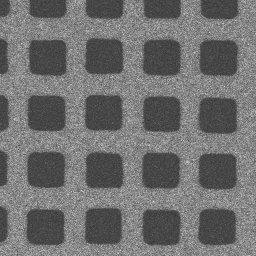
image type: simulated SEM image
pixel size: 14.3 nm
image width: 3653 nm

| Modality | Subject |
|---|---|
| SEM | a regular array of holes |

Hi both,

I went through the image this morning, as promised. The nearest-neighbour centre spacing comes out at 799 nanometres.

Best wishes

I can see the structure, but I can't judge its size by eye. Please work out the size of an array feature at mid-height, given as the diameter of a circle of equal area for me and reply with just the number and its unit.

0.574 micrometres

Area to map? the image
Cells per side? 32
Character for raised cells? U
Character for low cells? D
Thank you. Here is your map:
DUUUDDDDUUUDDDDUUUDDDDDUUDDDDDUU
DUUUDDDDUUUDDDDUUUDDDDDUUDDDDDUU
UUUUUUUUUUUUUUUUUUUUUUUUUUUUUUUU
UUUUUUUUUUUUUUUUUUUUUUUUUUUUUUUU
UUUUUUUUUUUUUUUUUUUUUUUUUUUUUUUU
DUUUDDDDUUUDDDDUUUDDDDUUUDDDDUUU
DUUUDDDDUUUDDDDUUUDDDDDUUDDDDDUU
DUUUDDDDUUUDDDDUUUDDDDDUUDDDDDUU
DUUUDDDDUUUDDDDUUUDDDDUUUDDDDDUU
UUUUUUUUUUUUUUUUUUUUUUUUUUUDDUUU
UUUUUUUUUUUUUUUUUUUUUUUUUUUUUUUU
UUUUUUUUUUUUUUUUUUUUUUUUUUUUUUUU
DUUUDDDDUUUDDDDUUUDDDDUUUDDDDUUU
DUUDDDDDUUUDDDDUUUDDDDDUUDDDDDUU
DUUDDDDDUUUDDDDUUUDDDDDUUDDDDDUU
DUUUDDDDUUUDDDDUUUDDDDDUUDDDDDUU
UUUUUUUUUUUUUUUUUUUUDUUUUUDDDUUU
UUUUUUUUUUUUUUUUUUUUUUUUUUUUUUUU
UUUUUUUUUUUUUUUUUUUUUUUUUUUUUUUU
DUUUDDDDUUUDDDDUUUDDDDUUUDDDDUUU
DUUDDDDDUUUDDDDUUUDDDDDUUDDDDDUU
DUUDDDDDUUUDDDDUUUDDDDDUUDDDDDUU
DUUDDDDDUUUDDDDUUUDDDDDUUDDDDDUU
UUUUUDDUUUUUDDUUUUUDDDUUUUDDDUUU
UUUUUUUUUUUUUUUUUUUUUUUUUUUUUUUU
UUUUUUUUUUUUUUUUUUUUUUUUUUUUUUUU
DUUUDDDDUUUDDDDUUUDDDDUUUDDDDUUU
DUUDDDDDUUUDDDDUUUDDDDDUUDDDDDUU
DUUDDDDDUUUDDDDUUUDDDDDUUDDDDDUU
DUUDDDDDUUUDDDDUUUDDDDDUUDDDDDUU
UUUUDDDDUUUUDDUUUUDDDDUUUDDDDUUU
UUUUUUUUUUUUUUUUUUUUUUUUUUUUUUUU